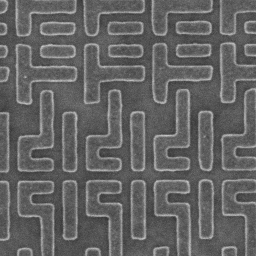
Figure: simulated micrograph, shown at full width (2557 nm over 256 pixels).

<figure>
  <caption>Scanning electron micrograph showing wiring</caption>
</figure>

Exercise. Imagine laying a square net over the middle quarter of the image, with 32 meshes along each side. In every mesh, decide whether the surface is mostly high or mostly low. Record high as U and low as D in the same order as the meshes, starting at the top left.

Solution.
DDDDDUUUUDDDDDDDDDDDDDUUUUUDDDDD
UUUDDUUUUUUUUUUUUUUUDDUUUUUUUUUU
UUUDDUUUUUUUUUUUUUUUDDUUUUUUUUUU
UUUDDUUUUUUUUUUUUUUUDDUUUUUUUUUU
DDDDDUUUUDDDDDDDDDDDDDUUUUDDDDDD
DDDDDUUUUDDDDDDDDDDDDDUUUUDDDDDD
DDDDDUUUUDDDDDDDDDDDDDUUUUDDDDDD
DDDDDUUUUDDUUUDDDDDDDDUUUUDDUUUD
DDDDDUUUUDDUUUDDDDDDDDDUUUDDUUUD
DDDDDUUUUDDUUUDDDDDDDDDUUDDDUUUD
DDDDDDDDDDDUUUDDDDDDDDDDDDDDUUUD
DDDDDDDDDDDUUUDDDDDDDDDDDDDDUUUD
UUUDDDDDDDDUUUDDDUUUDDDDDDDDUUUD
UUUDDDDDDDDUUUDDDUUUDDDDDDDDUUUD
UUUDDDDDDDDUUUDDDUUUDDDDDDDDUUUD
UUUDDDDDDDDUUUDDDUUUDDDDDDDDUUUD
UUUDDDDDDDDUUUDDDUUUDDDDDDDDUUUD
UUUDDDDDDDDUUUDDDUUUDDDDDDDDUUUD
UUUDDDUUUUUUUUDDDUUUDDDUUUUUUUUD
UUUDDDUUUUUUUUDDDUUUDDDUUUUUUUUD
UUUDDDUUUUUUUUDDDUUUDDDUUUUUUUUD
UUUDDDUUUDDDDDDDDUUUDDDUUUDDDDDD
UUUDDDUUUDDDDDDDDUUUDDDUUUDDDDDD
UUUDDDUUUDDDDDDDDUUUDDDUUUUUUUUD
UUUDDDUUUUUUUUDDDUUUDDDUUUUUUUUD
UUUDDDUUUUUUUUDDDUUUDDDUUUUUUUUD
UUUDDDUUUUUUUUDDDUUUDDDUUDUUDDDD
DDDDDDDDDDDDDDDDDDDDDDDDDDDDDDDD
DDDDDDDDDDDDDDDDDDDDDDDDDDDDDDDD
UUUDDDUUUUUUUUDDDUUUDDDUUUUUUUUD
UUUDDDUUUUUUUUDDDUUUDDDUUUUUUUUD
UUUDDDUUUUUUUUDDDUUUDDDUUUUUUUUD